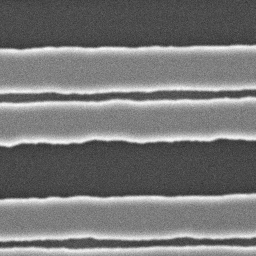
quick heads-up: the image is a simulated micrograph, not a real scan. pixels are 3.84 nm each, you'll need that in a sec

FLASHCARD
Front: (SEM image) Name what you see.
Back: lines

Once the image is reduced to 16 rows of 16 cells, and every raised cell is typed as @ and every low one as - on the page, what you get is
----------------
----------------
----------------
@@@@@@@@@@@@@@@@
@@@@@@@@@@@@@@@@
@@@@@@@@@@@@@@@@
@@@@@@@@@@@@@@@@
@@@@@@@@@@@@@@@@
@@@@@@@@@@@@@@@@
----------------
----------------
----------------
@@@@@@@@@@@@@@@@
@@@@@@@@@@@@@@@@
@@@@@@@@@@@@@@@@
@@@@@@@@@@@@@@@@